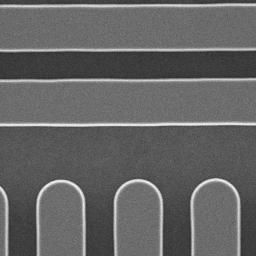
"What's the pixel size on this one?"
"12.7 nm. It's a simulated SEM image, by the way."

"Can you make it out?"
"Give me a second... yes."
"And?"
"groups of lines, slits or small figures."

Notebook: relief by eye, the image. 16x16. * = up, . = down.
****************
****************
****************
................
................
****************
****************
****************
................
................
................
...**...*....*..
..***..***..***.
..***..***..***.
..***..***..***.
..***..***..***.